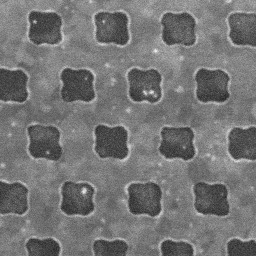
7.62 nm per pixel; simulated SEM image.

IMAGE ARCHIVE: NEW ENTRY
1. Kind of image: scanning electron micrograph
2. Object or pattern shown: a regular array of holes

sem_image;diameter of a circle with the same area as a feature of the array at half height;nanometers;284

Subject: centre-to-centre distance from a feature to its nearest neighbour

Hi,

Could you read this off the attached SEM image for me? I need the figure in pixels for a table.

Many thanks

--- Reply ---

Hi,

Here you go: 65.3